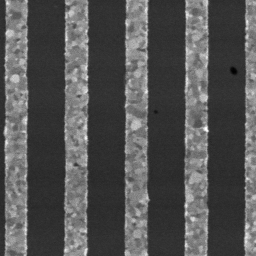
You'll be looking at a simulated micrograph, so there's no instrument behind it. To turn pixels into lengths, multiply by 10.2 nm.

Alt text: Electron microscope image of parallel lines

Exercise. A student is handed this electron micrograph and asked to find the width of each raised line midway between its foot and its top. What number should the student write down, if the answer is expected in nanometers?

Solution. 223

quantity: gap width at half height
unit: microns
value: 0.388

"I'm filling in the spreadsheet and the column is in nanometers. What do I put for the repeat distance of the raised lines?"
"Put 613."